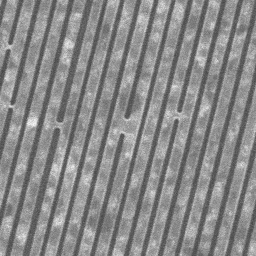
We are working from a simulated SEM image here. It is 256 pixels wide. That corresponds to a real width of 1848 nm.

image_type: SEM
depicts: parallel lines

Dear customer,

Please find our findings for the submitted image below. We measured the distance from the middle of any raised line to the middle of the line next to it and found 0.118 um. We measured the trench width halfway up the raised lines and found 41.1 nm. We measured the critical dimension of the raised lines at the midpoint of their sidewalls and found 0.0745 um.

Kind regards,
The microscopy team